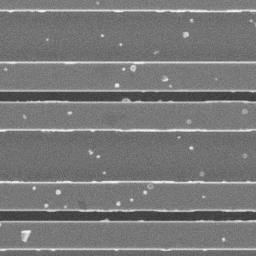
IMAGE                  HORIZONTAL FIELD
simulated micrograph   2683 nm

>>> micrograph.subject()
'lines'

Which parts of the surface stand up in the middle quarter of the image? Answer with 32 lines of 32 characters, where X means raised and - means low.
XXXXXXXXXXXXXXXXXXXXXXXXXXXXXXXX
XXXXXXXXXXXXXXXXXXXXXXXXXXXXXXXX
XXXXXXXXXXXXXXXXXXXXXXXXXXXXXXXX
XXXXXXXXXXXXXXXXXXXXXXXXXXXXXXXX
XXXXXXXXXXXXXXXXXXXXXXXXXXXXXXXX
XXXXXXXXXXXXXXXXXXXXXXXXXXXXXXXX
XXXXXXXXXXXXXXXXXXXXXXXXXXXXXXXX
--------------------------------
--------------------------------
X-----------------X-------X-----
XXXXXXXXXXXXXXXXXXXXXXXXXXXXXXXX
XXXXXXXXXXXXXXXXXXXXXXXXXXXXXXXX
XXXXXXXXXXXXXXXXXXXXXXXXXXXXXXXX
XXXXXXXXXXXXXXXXXXXXXXXXXXXXXXXX
XXXXXXXXXXXXXXXXXXXXXXXXXXXXXXXX
XXXXXXXXXXXXXXXXXXXXXXXXXXXXXXXX
XX-----X-----XXXXXXXXXXXXXXX-XXX
--------------------------------
--------------------------------
--------------------------------
--------------------------------
--------------------------------
--------------------------------
--------------------------------
--------------------------------
--------------------------------
--------------------------------
--------------------------------
--------------------------------
XX-----X-XXXXXXXXXXXXXXXXXXX---X
XXXXXXXXXXXXXXXXXXXXXXXXXXXXXXXX
XXXXXXXXXXXXXXXXXXXXXXXXXXXXXXXX